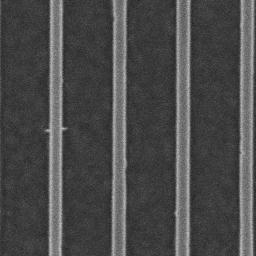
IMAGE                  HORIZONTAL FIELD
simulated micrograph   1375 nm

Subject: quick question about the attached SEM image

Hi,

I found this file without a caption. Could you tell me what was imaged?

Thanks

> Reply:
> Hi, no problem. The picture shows one or a few lines or trenches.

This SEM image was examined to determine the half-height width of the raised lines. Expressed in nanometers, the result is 62.4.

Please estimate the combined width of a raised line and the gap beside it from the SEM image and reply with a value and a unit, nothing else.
0.342 µm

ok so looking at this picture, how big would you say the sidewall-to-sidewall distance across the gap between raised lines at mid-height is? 276 nm